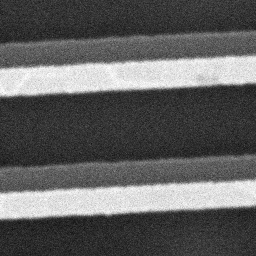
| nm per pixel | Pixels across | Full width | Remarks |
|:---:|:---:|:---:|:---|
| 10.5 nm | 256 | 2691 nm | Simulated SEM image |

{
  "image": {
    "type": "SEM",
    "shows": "lines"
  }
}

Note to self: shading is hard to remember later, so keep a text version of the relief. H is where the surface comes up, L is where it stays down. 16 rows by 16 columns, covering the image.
LLLLLLLLLLLLLLLL
LLLLLLLLLLLLLLLL
LLLLLLHHHHHHHHHH
HHHHHHHHHHHHHHHH
HHHHHHHHHHHHHHHH
HHHHHHHHHHLLLLLL
LLLLLLLLLLLLLLLL
LLLLLLLLLLLLLLLL
LLLLLLLLLLLLLLLL
LLLLLLLLLLLLLLLL
LLHHHHHHHHHHHHHH
HHHHHHHHHHHHHHHH
HHHHHHHHHHHHHHHH
HHHLLLLLLLLLLLLL
LLLLLLLLLLLLLLLL
LLLLLLLLLLLLLLLL